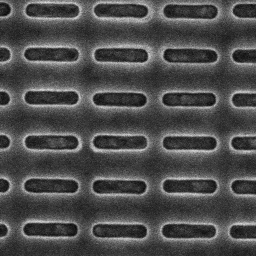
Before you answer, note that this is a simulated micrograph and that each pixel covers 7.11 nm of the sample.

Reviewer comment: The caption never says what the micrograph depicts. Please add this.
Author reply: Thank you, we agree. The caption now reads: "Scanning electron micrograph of a regular array of holes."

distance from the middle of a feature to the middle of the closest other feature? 309 nm